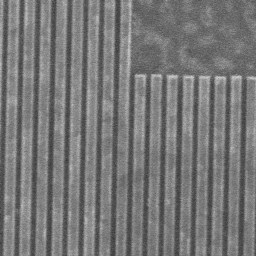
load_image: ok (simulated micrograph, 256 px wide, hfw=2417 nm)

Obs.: parallel lines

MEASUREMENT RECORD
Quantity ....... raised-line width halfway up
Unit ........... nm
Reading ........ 81.4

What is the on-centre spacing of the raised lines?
16 px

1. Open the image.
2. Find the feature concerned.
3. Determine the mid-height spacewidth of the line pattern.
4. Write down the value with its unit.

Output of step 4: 0.072 um